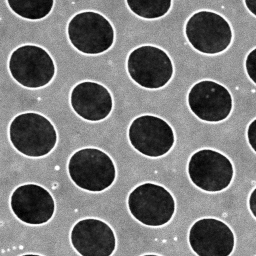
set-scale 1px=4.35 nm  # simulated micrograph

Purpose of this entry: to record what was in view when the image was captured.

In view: a regular array of holes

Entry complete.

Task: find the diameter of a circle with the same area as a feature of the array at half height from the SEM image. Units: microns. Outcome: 0.193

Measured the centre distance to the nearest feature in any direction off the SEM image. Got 296 nm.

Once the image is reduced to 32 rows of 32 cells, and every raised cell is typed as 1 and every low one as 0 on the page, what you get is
10000001111111110000011111111110
11000011111011111000011110111110
11111111100001111111111100001111
11111111000000111111111000000111
11111111100000111111111000000111
11111111100000111111111100000111
11000011110001111000011110011110
10000001111111110000011111111110
10000001111111110000001111111110
11000001111111110000011111111110
11100011110011111000011110011111
11111111100000111111111100000111
11111111100000111111111100000111
11111111100000111111111100000111
11000111110001111101111110001111
10000011111111110000011111111110
10000001111111110000001111111110
10000001111111110000001111111110
11000001111111111000011111111111
11100111100000111110111100001111
11111111100000111111111100000111
11111111100000111111111100000111
11111111100000111111111100000111
11000111110001111000011110001111
10000011111111110000011111111110
10000001111111110000001111111110
11000001111111110000001111111110
11100011110011111000011110011111
11111111100000111111111100000111
11111111100000111111111100000111
11111111100000111111111100000111
11111111110000111111111100000111